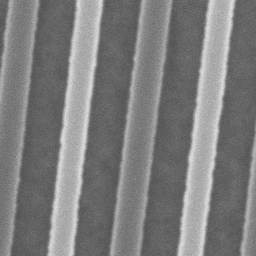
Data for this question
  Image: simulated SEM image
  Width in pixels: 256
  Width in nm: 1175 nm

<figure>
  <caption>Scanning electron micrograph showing lines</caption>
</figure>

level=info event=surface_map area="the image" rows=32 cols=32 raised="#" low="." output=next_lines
.####.....###.....###.....###...
.####.....###.....###.....###...
.####....###.....####.....###...
.###.....###.....####.....###...
.###.....###.....####.....###...
.###.....###.....####.....###...
####.....###.....####....###....
####.....###.....####....###....
####.....###.....###.....###....
####.....###.....###.....###....
####....####....####.....###....
###.....###.....####.....###....
###.....###.....####.....###....
###.....###.....####.....###....
###.....###.....####....###.....
###.....###.....###.....###.....
###.....###.....###.....###.....
###.....###.....###.....###.....
###.....###....####.....###.....
###....###.....####.....###.....
##.....###.....####.....###....#
##.....###.....####....####....#
##.....###.....####....###.....#
##.....###.....###.....###.....#
##.....###.....###.....###.....#
##.....###.....###.....###.....#
##.....###....####.....###.....#
##.....###....####.....###.....#
##....####....####.....###.....#
##....###.....####.....###.....#
#.....###.....####....###.....##
#.....###.....####....###.....##